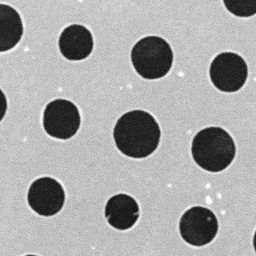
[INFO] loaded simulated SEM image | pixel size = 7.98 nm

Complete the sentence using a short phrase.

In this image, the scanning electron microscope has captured a regular array of holes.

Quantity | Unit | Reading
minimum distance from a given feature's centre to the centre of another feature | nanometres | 621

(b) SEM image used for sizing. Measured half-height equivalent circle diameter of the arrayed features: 0.321 µm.